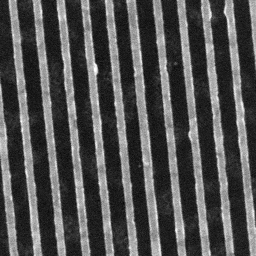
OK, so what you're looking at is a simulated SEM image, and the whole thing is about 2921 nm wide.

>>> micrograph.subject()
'parallel lines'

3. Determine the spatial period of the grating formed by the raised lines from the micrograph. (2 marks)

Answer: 273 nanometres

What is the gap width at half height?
16.9 pixels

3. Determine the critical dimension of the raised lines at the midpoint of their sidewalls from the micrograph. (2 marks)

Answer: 80.9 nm